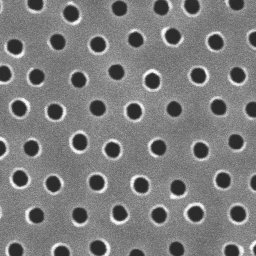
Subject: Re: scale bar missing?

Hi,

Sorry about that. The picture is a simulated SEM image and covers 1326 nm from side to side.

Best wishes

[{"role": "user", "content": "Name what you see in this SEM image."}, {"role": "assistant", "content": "a regular array of holes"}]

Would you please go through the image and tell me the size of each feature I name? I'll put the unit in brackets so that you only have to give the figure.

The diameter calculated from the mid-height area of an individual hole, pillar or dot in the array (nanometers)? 80.6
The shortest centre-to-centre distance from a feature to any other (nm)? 184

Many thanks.